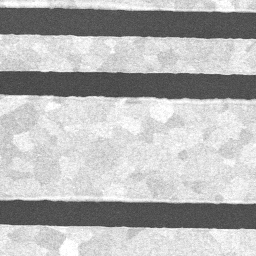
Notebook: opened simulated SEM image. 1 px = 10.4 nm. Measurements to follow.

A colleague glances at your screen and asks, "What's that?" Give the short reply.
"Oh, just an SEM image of lines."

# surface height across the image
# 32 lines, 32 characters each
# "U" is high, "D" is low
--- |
UUUUUUUUUUUUUUUUUUUUUUUUUUUUUUUU
DDDDDDDDDDDDDDDDDDDDDDDDDDDDDDDD
DDDDDDDDDDDDDDDDDDDDDDDDDDDDDDDD
DDDDDDDDDDDDDDDDDDDDDDDDDDDDDDDD
UUUUUDDDDDDDDDDDDDDDDDDDDDDDDDDD
UUUUUUUUUUUUUUUUUUUUUUUUUUUUUUUU
UUUUUUUUUUUUUUUUUUUUUUUUUUUUUUUU
UUUUUUUUUUUUUUUUUUUUUUUUUUUUUUUU
UUUUUUUUUUUUUUUUUUUUUUUUUUUUUUUU
DDDDDDDDDDDDDDDDDDDDDDDDDDDDDDDD
DDDDDDDDDDDDDDDDDDDDDDDDDDDDDDDD
DDDDDDDDDDDDDDDDDDDDDDDDDDDDDDDD
UUUUUUUUUUUUUUUUUUUUUDUUDDUUUDDD
UUUUUUUUUUUUUUUUUUUUUUUUUUUUUUUU
UUUUUUUUUUUUUUUUUUUUUUUUUUUUUUUU
UUUUUUUUUUUUUUUUUUUUUUUUUUUUUUUU
UUUUUUUUUUUUUUUUUUUUUUUUUUUUUUUU
UUUUUUUUUUUUUUUUUUUUUUUUUUUUUUUU
UUUUUUUUUUUUUUUUUUUUUUUUUUUUUUUU
UUUUUUUUUUUUUUUUUUUUUUUUUUUUUUUU
UUUUUUUUUUUUUUUUUUUUUUUUUUUUUUUU
UUUUUUUUUUUUUUUUUUUUUUUUUUUUUUUU
UUUUUUUUUUUUUUUUUUUUUUUUUUUUUUUU
UUUUUUUUUUUUUUUUUUUUUUUUUUUUUUUU
UUUUUUUUUUUUUUUUUUUUUUUUUUUUUUUU
DDDDDDDDDDDDDDDDDDDDDDDDDDDDDDDD
DDDDDDDDDDDDDDDDDDDDDDDDDDDDDDDD
DDDDDDDDDDDDDDDDDDDDDDDDDDDDDDDD
UUUUUUUUUUUUUUUUUUUDDDDDDDDDDDDD
UUUUUUUUUUUUUUUUUUUUUUUUUUUUUUUU
UUUUUUUUUUUUUUUUUUUUUUUUUUUUUUUU
UUUUUUUUUUUUUUUUUUUUUUUUUUUUUUUU